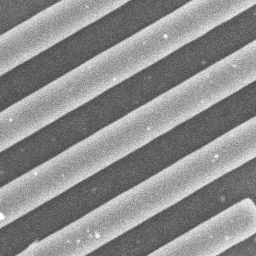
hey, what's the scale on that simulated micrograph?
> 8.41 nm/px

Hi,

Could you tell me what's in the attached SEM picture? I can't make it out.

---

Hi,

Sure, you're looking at groups of lines, slits or small figures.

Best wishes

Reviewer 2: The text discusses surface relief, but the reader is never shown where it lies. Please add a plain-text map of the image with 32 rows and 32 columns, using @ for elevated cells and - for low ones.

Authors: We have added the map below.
-------@@@@@@@@--------@@@@@@@@@
-----@@@@@@@@@--------@@@@@@@@--
----@@@@@@@@--------@@@@@@@@----
--@@@@@@@@--------@@@@@@@@@-----
@@@@@@@@@--------@@@@@@@@-------
@@@@@@@--------@@@@@@@@--------@
@@@@@--------@@@@@@@@--------@@@
@@@--------@@@@@@@@@--------@@@@
@@--------@@@@@@@@--------@@@@@@
--------@@@@@@@@--------@@@@@@@@
------@@@@@@@@@--------@@@@@@@@-
----@@@@@@@@@--------@@@@@@@@---
---@@@@@@@@--------@@@@@@@@@----
-@@@@@@@@@-------@@@@@@@@@------
@@@@@@@@--------@@@@@@@@--------
@@@@@@--------@@@@@@@@--------@@
@@@@--------@@@@@@@@@--------@@@
@@@--------@@@@@@@@--------@@@@@
@--------@@@@@@@@--------@@@@@@@
-------@@@@@@@@@-------@@@@@@@@@
-----@@@@@@@@@--------@@@@@@@@--
----@@@@@@@@--------@@@@@@@@@---
--@@@@@@@@--------@@@@@@@@@-----
@@@@@@@@@--------@@@@@@@@-------
@@@@@@@--------@@@@@@@@---------
@@@@@--------@@@@@@@@@--------@@
@@@@-------@@@@@@@@@--------@@@@
@@--------@@@@@@@@--------@@@@@@
--------@@@@@@@@@-------@@@@@@@@
------@@@@@@@@@--------@@@@@@@@-
----@@@@@@@@@--------@@@@@@@@---
---@@@@@@@@--------@@@@@@@@@----